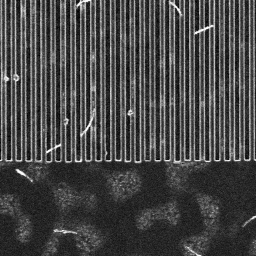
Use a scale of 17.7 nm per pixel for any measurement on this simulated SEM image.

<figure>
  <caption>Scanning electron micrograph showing parallel lines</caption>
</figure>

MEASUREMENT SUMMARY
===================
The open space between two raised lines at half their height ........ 84.1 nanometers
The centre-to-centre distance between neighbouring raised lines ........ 176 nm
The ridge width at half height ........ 97.4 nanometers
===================